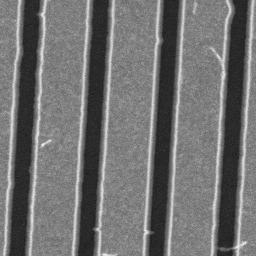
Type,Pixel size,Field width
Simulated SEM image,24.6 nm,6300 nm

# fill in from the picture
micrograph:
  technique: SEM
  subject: one or a few lines or trenches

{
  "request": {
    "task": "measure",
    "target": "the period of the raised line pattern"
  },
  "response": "1710 nanometers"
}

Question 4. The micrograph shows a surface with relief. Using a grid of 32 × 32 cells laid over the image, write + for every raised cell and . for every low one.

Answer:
+++..++++++...++++++...++++++..+
+++..++++++...++++++...++++++..+
++...++++++...++++++...++++++..+
++...++++++...++++++...+++++...+
++...++++++...++++++...+++++...+
++...++++++...++++++..++++++...+
++...++++++...++++++..++++++...+
++...++++++...++++++..++++++...+
++...++++++...++++++..++++++...+
++...++++++...+++++...++++++...+
++...++++++..++++++...++++++...+
++...++++++..++++++...++++++...+
++...++++++..++++++...++++++...+
++...+++++...++++++...++++++...+
++...+++++...++++++...++++++...+
++...+++++...++++++...++++++...+
++..++++++...++++++...++++++..++
++..++++++...++++++...++++++..++
++..++++++...++++++...++++++..++
+...++++++...++++++...+++++...++
+...++++++...++++++...+++++...++
+...++++++...++++++...+++++...++
+...++++++...++++++..++++++...++
+...++++++...++++++..++++++...++
+...++++++...++++++..++++++...++
+...++++++..+++++++..++++++...++
+...++++++..+++++++..++++++...++
+...++++++..++++++...++++++...++
+...++++++..++++++...++++++...++
+...+++++...++++++...++++++...++
+...+++++...++++++...++++++...++
+...+++++...++++++...++++++..+++